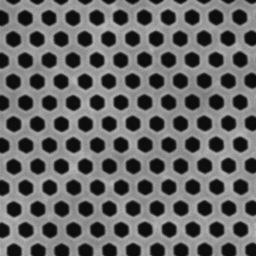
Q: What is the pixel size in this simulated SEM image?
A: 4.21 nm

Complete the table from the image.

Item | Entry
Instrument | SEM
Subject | a regular array of holes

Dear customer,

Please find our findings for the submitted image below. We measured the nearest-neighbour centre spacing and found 99.6 nanometres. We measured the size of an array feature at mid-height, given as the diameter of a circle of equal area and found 63.2 nm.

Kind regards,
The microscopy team